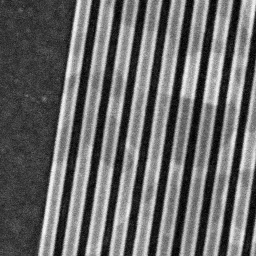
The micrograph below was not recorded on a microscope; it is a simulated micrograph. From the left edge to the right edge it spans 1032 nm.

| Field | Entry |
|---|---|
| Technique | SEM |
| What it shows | parallel lines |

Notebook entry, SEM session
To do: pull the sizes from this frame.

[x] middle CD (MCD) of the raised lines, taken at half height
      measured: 11.6 px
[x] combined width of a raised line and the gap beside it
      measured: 93.7 nm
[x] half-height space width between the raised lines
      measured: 0.0463 µm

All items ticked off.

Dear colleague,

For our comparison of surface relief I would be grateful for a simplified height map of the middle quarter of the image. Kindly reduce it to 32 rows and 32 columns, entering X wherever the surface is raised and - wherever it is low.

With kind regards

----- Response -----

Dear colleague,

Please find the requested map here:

-XXX---XXX---XXX---XXX---XXX---X
-XXX---XXX---XXX---XX----XX---XX
-XXX---XXX---XX----XX---XXX---XX
-XXX---XX----XX---XXX---XXX---XX
-XX----XX---XXX---XXX---XXX---XX
-XX---XXX---XXX---XXX---XXX---XX
XXX---XXX---XXX---XXX---XXX---XX
XXX---XXX---XXX---XXX---XXX--XXX
XXX---XXX---XXX---XX---XXX---XXX
XX----XXX---XX---XXX---XXX---XXX
XX----XX---XXX---XXX---XXX---XXX
XX---XXX---XXX---XXX---XXX---XXX
XX---XXX---XXX---XXX---XXX---XXX
XX---XXX---XXX---XXX---XX----XXX
XX---XXX---XXX---XX----XX---XXX-
XX---XXX---XX----XX---XXX---XXX-
XX---XX----XX---XXX---XXX---XXX-
XX---XX---XXX---XXX---XXX---XXX-
X---XXX---XXX---XXX---XXX---XXX-
X---XXX---XXX---XXX---XXX---XXX-
X---XXX---XXX---XXX---XX---XXX--
X---XXX---XXX---XX---XXX---XXX--
X---XXX---XX---XXX---XXX---XXX--
X---XX---XXX---XXX---XXX---XXX--
---XXX---XXX---XXX---XXX---XXX--
---XXX---XXX---XXX---XXX---XXX--
---XXX---XXX---XXX---XXX---XX---
---XXX---XXX---XXX---XXX--XXX---
---XXX---XXX---XX---XXX---XXX---
---XXX---XX---XXX---XXX---XXX---
---XX---XXX---XXX---XXX---XXX---
--XXX---XXX---XXX---XXX---XXX---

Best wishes